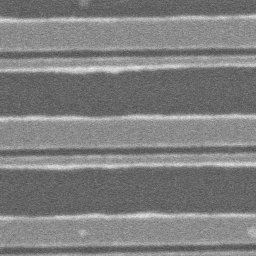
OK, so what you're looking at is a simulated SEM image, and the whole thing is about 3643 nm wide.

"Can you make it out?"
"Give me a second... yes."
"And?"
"lines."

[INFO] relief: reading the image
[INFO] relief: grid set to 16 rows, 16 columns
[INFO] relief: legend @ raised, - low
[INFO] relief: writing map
----------------
@@@@@@@@@@@@@@@@
@@@@@@@@@@@@@@@@
@@@@@@@@@@@@@@@@
----------------
----------------
----------------
@@@@@@@@@@@@@@@@
@@@@@@@@@@@@@@@@
@@@@@@@@@@@@@@@@
----------------
----------------
----------------
-----@--@@@@@@@@
@@@@@@@@@@@@@@@@
@@@@@@@@@@@@@@@@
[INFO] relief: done